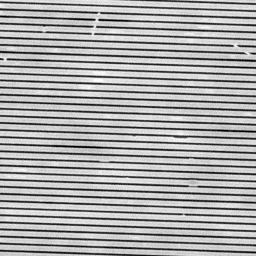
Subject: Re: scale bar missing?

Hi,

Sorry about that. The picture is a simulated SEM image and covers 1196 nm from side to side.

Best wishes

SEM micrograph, parallel lines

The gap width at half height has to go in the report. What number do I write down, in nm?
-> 11.7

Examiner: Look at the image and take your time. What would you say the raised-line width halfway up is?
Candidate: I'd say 23.9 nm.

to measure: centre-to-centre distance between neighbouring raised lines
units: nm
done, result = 33.1